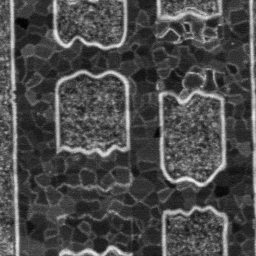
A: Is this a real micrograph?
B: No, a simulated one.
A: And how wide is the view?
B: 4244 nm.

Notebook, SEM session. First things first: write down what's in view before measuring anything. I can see one or a few lines or trenches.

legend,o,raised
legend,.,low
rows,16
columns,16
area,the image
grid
.oo.....oo....oo
.oo.....oooooooo
.ooo....oooooooo
.ooooooooooooooo
.ooooooooooooooo
.ooo....oooooooo
.ooo....oo....oo
.ooo....oo....oo
.ooo....oo....oo
.ooooooooo....oo
.ooooooooo....oo
.ooooooooooooooo
.ooooooooooooooo
.oooooooooo...oo
.ooooooooo....oo
.ooooooooo....oo